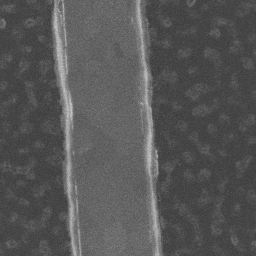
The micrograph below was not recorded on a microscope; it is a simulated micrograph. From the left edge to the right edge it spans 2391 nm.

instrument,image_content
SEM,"one or a few lines or trenches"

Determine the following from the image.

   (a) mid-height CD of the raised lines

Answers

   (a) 0.782 microns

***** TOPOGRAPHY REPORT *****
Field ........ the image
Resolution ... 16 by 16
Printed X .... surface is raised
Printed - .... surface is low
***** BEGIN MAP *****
---XXXXXX-------
---XXXXXX-------
----XXXXX-------
----XXXXX-------
----XXXXX-------
----XXXXX-------
----XXXXX-------
----XXXXX-------
----XXXXX-------
----XXXXX-------
----XXXXX-------
----XXXXX-------
----XXXXXX------
----XXXXXX------
----XXXXXX------
-----XXXXX------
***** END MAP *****